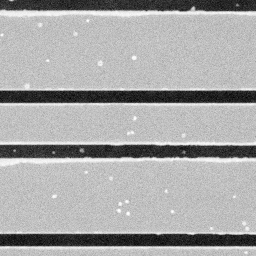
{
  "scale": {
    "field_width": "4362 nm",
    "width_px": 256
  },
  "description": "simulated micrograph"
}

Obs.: lines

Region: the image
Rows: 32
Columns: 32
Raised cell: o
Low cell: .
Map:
................................
................................
oooooooooooooooooooooooooooooooo
oooooooooooooooooooooooooooooooo
oooooooooooooooooooooooooooooooo
oooooooooooooooooooooooooooooooo
oooooooooooooooooooooooooooooooo
oooooooooooooooooooooooooooooooo
oooooooooooooooooooooooooooooooo
oooooooooooooooooooooooooooooooo
oooooooooooooooooooooooooooooooo
................................
................................
oooooooooooooooooooooooooooooooo
oooooooooooooooooooooooooooooooo
oooooooooooooooooooooooooooooooo
oooooooooooooooooooooooooooooooo
oooooooooooooooooooooooooooooooo
................................
................................
oooooooooooooooooooooooooooooooo
oooooooooooooooooooooooooooooooo
oooooooooooooooooooooooooooooooo
oooooooooooooooooooooooooooooooo
oooooooooooooooooooooooooooooooo
oooooooooooooooooooooooooooooooo
oooooooooooooooooooooooooooooooo
oooooooooooooooooooooooooooooooo
oooooooooooooooooooooooooooooooo
................................
................................
oooooooooooooooooooooooooooooooo